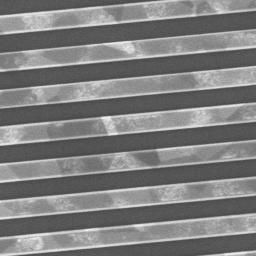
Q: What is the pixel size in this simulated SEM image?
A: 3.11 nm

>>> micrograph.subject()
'parallel lines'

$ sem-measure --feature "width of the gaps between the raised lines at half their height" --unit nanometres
58.5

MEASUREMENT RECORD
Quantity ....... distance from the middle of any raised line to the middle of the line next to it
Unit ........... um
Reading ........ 0.115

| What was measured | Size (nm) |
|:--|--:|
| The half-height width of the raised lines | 55.8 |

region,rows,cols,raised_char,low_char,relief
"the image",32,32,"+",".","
.................+++++++++++++++
......++++++++++++++++++++++++..
+++++++++++++++++++.............
++++++++........................
.......................+++++++++
.............+++++++++++++++++++
..++++++++++++++++++++++++......
+++++++++++++++.................
++++..........................++
...................+++++++++++++
.........+++++++++++++++++++++++
+++++++++++++++++++++...........
+++++++++++.....................
..........................++++++
...............+++++++++++++++++
....++++++++++++++++++++++++....
+++++++++++++++++...............
+++++++.........................
.....................+++++++++++
...........+++++++++++++++++++++
++++++++++++++++++++++++........
+++++++++++++...................
++..........................++++
.................+++++++++++++++
........++++++++++++++++++++++..
+++++++++++++++++++.............
+++++++++.......................
.........................+++++++
..............++++++++++++++++++
....++++++++++++++++++++++......
+++++++++++++++.................
+++++..........................+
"